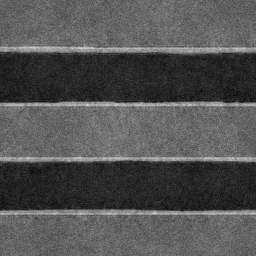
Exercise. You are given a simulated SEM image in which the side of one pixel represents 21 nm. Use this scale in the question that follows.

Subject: lines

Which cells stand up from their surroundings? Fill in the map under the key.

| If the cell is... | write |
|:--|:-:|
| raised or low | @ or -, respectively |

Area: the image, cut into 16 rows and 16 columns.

@@@@@@@@@@@@@@@@
@@@@@@@@@@@@@@@@
@@@@@@@@@@@@@@@@
----------------
----------------
----------------
----------------
@@@@@@@@@@@@@@@@
@@@@@@@@@@@@@@@@
@@@@@@@@@@@@@@@@
----------------
----------------
----------------
@@@@@@@@@@@@@@@@
@@@@@@@@@@@@@@@@
@@@@@@@@@@@@@@@@